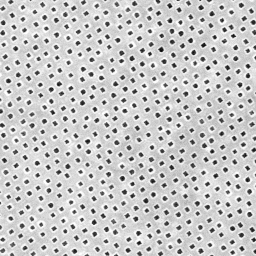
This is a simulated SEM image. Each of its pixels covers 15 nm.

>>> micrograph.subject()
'a regular array of holes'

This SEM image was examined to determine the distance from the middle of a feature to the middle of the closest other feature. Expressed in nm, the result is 155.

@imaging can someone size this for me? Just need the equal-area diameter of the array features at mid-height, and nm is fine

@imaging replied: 82.8